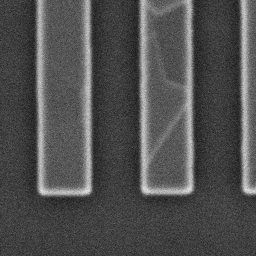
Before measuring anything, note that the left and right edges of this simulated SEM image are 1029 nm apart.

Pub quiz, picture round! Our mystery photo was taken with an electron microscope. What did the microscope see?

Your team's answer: wiring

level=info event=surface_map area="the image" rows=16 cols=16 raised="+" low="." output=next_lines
..++++...+++...+
..++++...+++...+
..++++...+++...+
..++++...+++...+
..++++...+++...+
..++++...+++...+
..++++...+++...+
..++++...+++...+
..++++...+++...+
..++++...+++...+
..++++...+++...+
..++++...+++...+
................
................
................
................